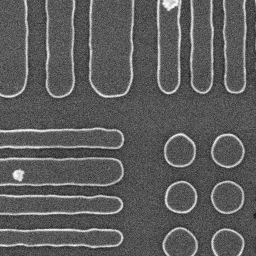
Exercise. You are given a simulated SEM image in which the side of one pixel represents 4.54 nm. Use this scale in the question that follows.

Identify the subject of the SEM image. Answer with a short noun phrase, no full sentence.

groups of lines, slits or small figures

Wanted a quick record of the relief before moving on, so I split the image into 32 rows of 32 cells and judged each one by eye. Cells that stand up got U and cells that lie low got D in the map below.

UUUDDDUUUDDUUUUUUDDDUUUDUUDDUUUD
UUUDDDUUUDDUUUUUUDDDUUDDUUDDUUUD
UUUDDDUUUDDUUUUUUDDDUUDDUUDDUUUD
UUUDDDUUUDDUUUUUUDDDUUDDUUUDUUUD
UUUDDDUUUDDUUUUUDDDDUUUDUUUDUUUD
UUUDDDUUUDDUUUUUUDDDUUDDUUUDUUUD
UUUDDDUUUDDUUUUUUDDDUUDDUUUDUUUD
UUUDDDUUUDDUUUUUDDDDUUDDUUUDUUUD
UUUDDDUUUDDUUUUUDDDDUUDDUUUDUUUD
UUUDDDUUUDDUUUUUDDDDUUDDUUUDUUUD
UUUDDDUUUDDUUUUUDDDDUUDDUUDDUUUD
UUUDDDUUUDDDUUUUDDDDDUDDDUDDDUDD
DDDDDDDDDDDDDDDDDDDDDDDDDDDDDDDD
DDDDDDDDDDDDDDDDDDDDDDDDDDDDDDDD
DDDDDDDDDDDDDDDDDDDDDDDDDDDDDDDD
DDDDDDDDDDDDDDDDDDDDDDDDDDDDDDDD
UUUUUUUUUUUUUUUDDDDDDDDDDDDDDDDD
UUUUUUUUUUUUUUUDDDDDDUUUDDDUUUDD
DDDDDDDDDDDDDUUDDDDDDUUUDDDUUUDD
DDDDDDDDDDDDDDDDDDDDDUUUDDDUUUDD
UUUUUUUUUUUUUUUDDDDDDUUUDDDUUUDD
UUUUUUUUUUUUUUUDDDDDDDDDDDDDDDDD
UUUUUUUUUUUUUUUDDDDDDDDDDDDDDDDD
DDDDDDDDDDDDDDDDDDDDDUUUDDDUUUDD
UDDDDDDDDDDDDDDDDDDDDUUUUDUUUUDD
UUUUUUUUUUUUUUUDDDDDDUUUDDDUUUDD
UUUUUUUUUUUUUUUDDDDDDDUDDDDDUDDD
DDDDDDDDDDDDDDDDDDDDDDDDDDDDDDDD
DDDDDDDDDDDDDDDDDDDDDDDDDDDDDDDD
UUUUUUUUUUUUUUUDDDDDDUUUDDDUUUDD
UUUUUUUUUUUUUUUDDDDDUUUUUDDUUUDD
DDDDDDDDDDDDDDDDDDDDDUUUDDDUUUDD